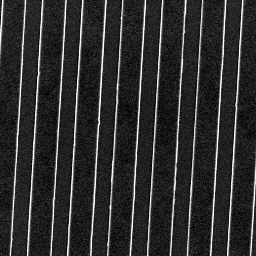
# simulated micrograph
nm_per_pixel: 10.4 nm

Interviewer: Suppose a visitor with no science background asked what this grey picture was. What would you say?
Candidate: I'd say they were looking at parallel lines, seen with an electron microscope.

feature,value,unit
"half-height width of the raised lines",246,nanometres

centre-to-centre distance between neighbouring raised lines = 414 nanometres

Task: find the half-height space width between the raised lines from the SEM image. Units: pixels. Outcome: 16.1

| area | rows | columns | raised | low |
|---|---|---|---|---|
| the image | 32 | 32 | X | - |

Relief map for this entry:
XXX--XXX--XXX--XXX--XXX--XXX--XX
XXX--XXX--XXX--XXX--XXX--XXX--XX
XXX--XXX--XXX--XXX--XXX--XXX--XX
XXX--XXX--XXX--XXX--XXX--XXX--XX
XXX--XXX--XXX--XXX--XXX--XXX--XX
XXX--XXX--XXX--XXX--XXX--XXX--XX
XXX--XXX--XXX--XXX--XXX--XXX--XX
XXX--XXX--XXX--XXX--XXX--XXX--XX
XXX--XXX--XXX--XXX--XXX--XXX--XX
XXX--XXX--XXX--XXX--XXX--XXX--XX
XXX--XXX--XXX--XXX--XXX--XXX--XX
XXX--XXX--XXX--XXX--XXX--XXX--XX
XX---XXX--XXX--XX---XX---XXX--XX
XX--XXX---XX---XX---XX--XXX---XX
XX--XXX---XX--XXX--XXX--XXX---XX
XX--XXX--XXX--XXX--XXX--XXX--XXX
XX--XXX--XXX--XXX--XXX--XXX--XXX
XX--XXX--XXX--XXX--XXX--XXX--XXX
XX--XXX--XXX--XXX--XXX--XXX--XXX
XX--XXX--XXX--XXX--XXX--XXX--XXX
XX--XXX--XXX--XXX--XXX--XXX--XXX
XX--XXX--XXX--XXX--XXX--XXX--XXX
XX--XXX--XXX--XXX--XXX--XXX--XXX
XX--XXX--XXX--XXX--XXX--XXX--XXX
XX--XXX--XXX--XXX--XXX--XXX--XXX
XX--XXX--XXX--XXX--XXX--XXX--XXX
XX--XXX--XXX--XXX--XXX--XXX--XXX
XX--XXX--XXX--XXX--XXX--XXX--XXX
XX--XXX--XXX--XXX--XXX--XXX--XXX
X---XXX--XXX--XX---XX---XXX--XXX
X--XXX---XX---XX---XX--XXX---XX-
X--XXX--XXX--XXX--XXX--XXX--XXX-